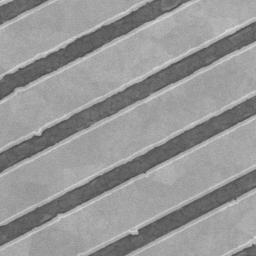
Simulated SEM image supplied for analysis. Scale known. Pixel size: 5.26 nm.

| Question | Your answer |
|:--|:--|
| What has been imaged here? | one or a few lines or trenches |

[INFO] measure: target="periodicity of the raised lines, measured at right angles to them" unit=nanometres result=345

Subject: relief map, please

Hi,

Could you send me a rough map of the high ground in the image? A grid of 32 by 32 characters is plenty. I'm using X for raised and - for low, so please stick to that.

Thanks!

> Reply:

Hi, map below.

------XXXXXXXXXXXX-----XXXXXXXXX
----XXXXXXXXXXXX------XXXXXXXXXX
--XXXXXXXXXXXX------XXXXXXXXXXXX
XXXXXXXXXXXX------XXXXXXXXXXXX--
XXXXXXXXXX------XXXXXXXXXXXX----
XXXXXXXX------XXXXXXXXXXXX------
XXXXXX------XXXXXXXXXXXX------XX
XXXX------XXXXXXXXXXXX------XXXX
XX------XXXXXXXXXXXX------XXXXXX
------XXXXXXXXXXXX------XXXXXXXX
----XXXXXXXXXXXX------XXXXXXXXXX
--XXXXXXXXXXXX------XXXXXXXXXXXX
XXXXXXXXXXXX------XXXXXXXXXXXX--
XXXXXXXXXX------XXXXXXXXXXXX----
XXXXXXXX------XXXXXXXXXXXX------
XXXXXX------XXXXXXXXXXXX------XX
XXXXX-----XXXXXXXXXXXX------XXXX
XXX------XXXXXXXXXXXX-----XXXXXX
X------XXXXXXXXXXXX-----XXXXXXXX
-----XXXXXXXXXXXX-----XXXXXXXXXX
--XXXXXXXXXXXXX-----XXXXXXXXXXXX
-XXXXXXXXXXXX------XXXXXXXXXXXX-
XXXXXXXXXXX------XXXXXXXXXXXX---
XXXXXXXXX------XXXXXXXXXXXX-----
XXXXXXX------XXXXXXXXXXXX------X
XXXXX------XXXXXXXXXXXX------XXX
XXX------XXXXXXXXXXXX------XXXXX
X------XXXXXXXXXXXX------XXXXXXX
-----XXXXXXXXXXXX------XXXXXXXXX
---XXXXXXXXXXXX------XXXXXXXXXXX
-XXXXXXXXXXXX------XXXXXXXXXXXX-
XXXXXXXXXXX------XXXXXXXXXXXX---